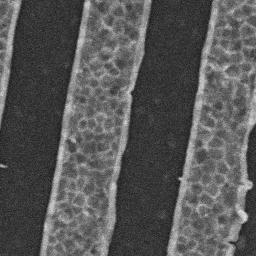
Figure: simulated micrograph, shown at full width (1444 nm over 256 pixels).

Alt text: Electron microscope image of one or a few lines or trenches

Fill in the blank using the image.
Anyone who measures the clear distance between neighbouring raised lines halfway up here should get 0.384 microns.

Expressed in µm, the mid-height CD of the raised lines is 0.33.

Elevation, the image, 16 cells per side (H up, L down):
HLLLLHHHHLLLLHHH
HLLLLHHHHLLLLHHH
HLLLLHHHHLLLLHHH
HLLLLHHHHLLLLHHH
LLLLLHHHLLLLLHHH
LLLLHHHHLLLLLHHH
LLLLHHHHLLLLHHHH
LLLLHHHHLLLLHHHH
LLLLHHHHLLLLHHHL
LLLLHHHHLLLLHHHL
LLLLHHHLLLLLHHHL
LLLHHHHLLLLHHHHL
LLLHHHHLLLLHHHHL
LLLHHHHLLLLHHHHL
LLLHHHHLLLLHHHHL
LLLHHHHLLLLHHHLL